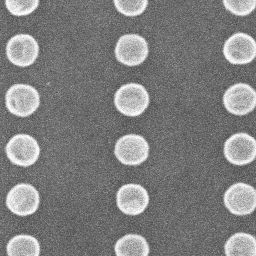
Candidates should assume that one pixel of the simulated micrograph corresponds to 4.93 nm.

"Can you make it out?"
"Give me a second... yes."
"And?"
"a regular array of raised bodies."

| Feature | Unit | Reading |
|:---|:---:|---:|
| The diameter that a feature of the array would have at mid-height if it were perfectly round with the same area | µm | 0.153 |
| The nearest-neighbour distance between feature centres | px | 49.6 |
